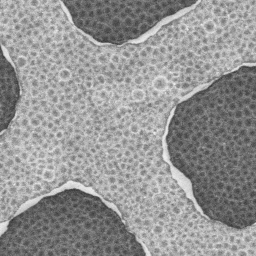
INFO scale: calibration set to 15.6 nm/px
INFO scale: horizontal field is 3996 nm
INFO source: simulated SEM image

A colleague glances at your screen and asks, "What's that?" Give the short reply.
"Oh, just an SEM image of holes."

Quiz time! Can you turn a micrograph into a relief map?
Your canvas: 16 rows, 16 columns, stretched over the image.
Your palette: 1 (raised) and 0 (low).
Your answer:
1111000000001111
1111100000111111
1111110011111111
1111111111111111
0111111111111100
0111111111110000
0111111111100000
0111111111100000
1111111111000000
1111111111000000
1111111111100000
1111111111110000
1100001111110000
1000000111111000
0000000011111111
0000000001111111